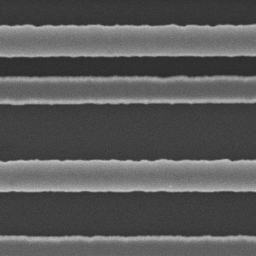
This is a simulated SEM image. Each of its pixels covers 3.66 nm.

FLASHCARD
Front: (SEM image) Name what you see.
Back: lines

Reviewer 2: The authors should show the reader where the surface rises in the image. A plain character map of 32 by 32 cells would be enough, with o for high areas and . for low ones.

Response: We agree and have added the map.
................................
................................
................................
oooooooooooooooooooooooooooooooo
oooooooooooooooooooooooooooooooo
oooooooooooooooooooooooooooooooo
oooooooooooooooooooooooooooooooo
................................
................................
......................o....ooo..
oooooooooooooooooooooooooooooooo
oooooooooooooooooooooooooooooooo
oooooooooooooooooooooooooooooooo
................................
................................
................................
................................
................................
................................
................................
oooooooooooooooooooooooooooooooo
oooooooooooooooooooooooooooooooo
oooooooooooooooooooooooooooooooo
oooooooooooooooooooooooooooooooo
................................
................................
................................
................................
................................
................................
oooooooooooooooooooooooooooooooo
oooooooooooooooooooooooooooooooo